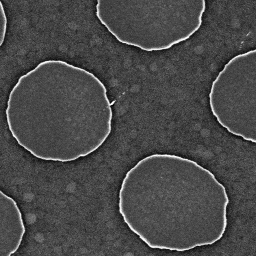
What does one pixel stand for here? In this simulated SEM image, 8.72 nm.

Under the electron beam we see raised bodies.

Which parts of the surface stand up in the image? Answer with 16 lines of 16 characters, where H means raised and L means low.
LLLLLLHHHHHHHLLL
LLLLLLHHHHHHLLLL
LLLLLLLLHHHLLLLL
LLLLLLLLLLLLLLLH
LLHHHLLLLLLLLLHH
LHHHHHLLLLLLLHHH
LHHHHHHLLLLLLHHH
LHHHHHHLLLLLLLHH
LHHHHHHLLLLLLLLH
LLHHHHLLLLLLLLLL
LLLLLLLLHHHHHLLL
LLLLLLLLHHHHHHLL
HLLLLLLLHHHHHHLL
HLLLLLLLHHHHHHLL
HLLLLLLLHHHHHHLL
HLLLLLLLLLHHLLLL